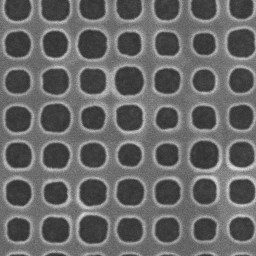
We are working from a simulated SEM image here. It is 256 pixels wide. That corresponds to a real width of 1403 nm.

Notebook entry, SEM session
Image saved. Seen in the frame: a regular array of holes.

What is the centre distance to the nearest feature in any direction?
202 nm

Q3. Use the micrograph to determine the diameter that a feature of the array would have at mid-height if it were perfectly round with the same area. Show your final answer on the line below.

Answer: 150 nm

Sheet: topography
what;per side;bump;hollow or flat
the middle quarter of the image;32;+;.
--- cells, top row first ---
+++++++++++++++...++++++++++++++
+++++.....+++......+++++....++++
.+++......+++.......+++......+++
.+++.......++.......+++......+++
.+++.......++.......+++......+++
.+++.......++.......+++......+++
.+++......+++......++++......+++
++++++...+++++.....+++++...+++++
++++++++++++++++++++++++++++++++
++++++++++++++++++++++++++++++++
.+++++...+++++.....++++++.++++++
.+++......+++......+++++....++++
..++......+++.......+++......+++
..++......+++.......+++......+++
..++......+++.......+++......+++
.++++.....+++.......+++.....++++
++++++...+++++.....+++++++++++++
++++++++++++++++++++++++++++++++
++++++++++++++++++++++++++++++++
+++++++.++++++++++++++++++++++++
.++++.....++++.....+++++....++++
.+++......++++.....++++......+++
..++.......++.......+++......++.
.+++.......++.......+++......++.
.+++......++++.....++++......++.
.++++.....+++++...++++++...+++++
++++++++++++++++++++++++++++++++
+++++++++++++++++++++++++++.....
+++++++++++++++...+++++++++++...
+++++.....++++.....++++.....++++
.+++.......++.......+++......+++
.+++.......++.......++.......+++